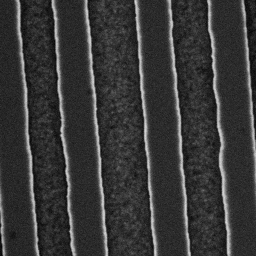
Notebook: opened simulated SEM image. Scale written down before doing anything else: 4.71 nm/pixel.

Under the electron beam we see lines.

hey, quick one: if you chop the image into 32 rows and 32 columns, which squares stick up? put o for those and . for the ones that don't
oo.....oooo......oooo.....ooooo.
oo.....oooo......oooo.....ooooo.
oo.....oooo......ooooo....ooooo.
oo.....oooo......ooooo....ooooo.
ooo....oooo......ooooo....ooooo.
ooo....oooo......ooooo....ooooo.
ooo....oooo......ooooo....ooooo.
ooo....oooo......ooooo.....oooo.
ooo....ooooo.....ooooo.....oooo.
ooo....ooooo.....ooooo.....oooo.
ooo....ooooo......oooo.....oooo.
ooo....ooooo......oooo.....oooo.
ooo....ooooo......oooo.....ooooo
ooo.....oooo......oooo.....ooooo
ooo.....oooo......ooooo....ooooo
ooo.....oooo......ooooo....ooooo
oooo....oooo......ooooo....ooooo
oooo....oooo......ooooo.....oooo
oooo....oooo......ooooo.....oooo
oooo....ooooo.....ooooo....ooooo
oooo....ooooo.....ooooo....ooooo
oooo....ooooo......oooo.....oooo
oooo....ooooo......oooo.....oooo
oooo.....oooo......oooo.....oooo
oooo.....oooo......oooo.....oooo
oooo.....oooo......oooo.....oooo
oooo.....oooo......oooo.....oooo
ooooo....oooo......oooo.....oooo
ooooo....oooo......oooo.....oooo
ooooo....oooo......ooooo....oooo
ooooo....oooo......ooooo....oooo
ooooo....oooo......ooooo....oooo